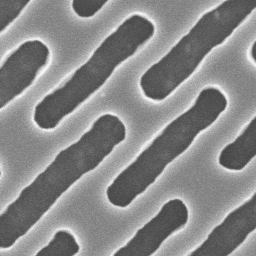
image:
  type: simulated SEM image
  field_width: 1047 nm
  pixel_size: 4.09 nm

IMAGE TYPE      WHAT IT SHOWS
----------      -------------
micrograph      holes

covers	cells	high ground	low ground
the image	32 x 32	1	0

00011111100001111111111111110000
00011111100011111111111111000001
00111111111111110001111110000001
01111111111111100001111100000111
11111111111111000001111000000111
11100111111110000011110000011111
11000011111100000111100000111110
10000011111000001111000001111111
00000111110000111110000001111111
00000111100000111100000011111111
00001110000001111000000111111111
00011100000011111100011110001111
00111000000111111110111100001111
11110000001111111111111100001111
11110000111110111111110000011111
11111001111100011111100000111110
11111111111000001111000001111100
11111111110000011110000011111000
11111111000000111100000111110000
11111110000001111000001111100000
11111100000011110000011111110001
11111000000111100000111111111111
11110000001111000001111111111111
11100000011110000011111111111111
11000000111110000111111111111110
10000001111111001111100111111100
00000011111111111111000111111000
00000111111111111110000111110000
00001111111111111100000111100000
00011110011111111000011111000001
00111100001111110000111110000011
11111000001111000001111100000111